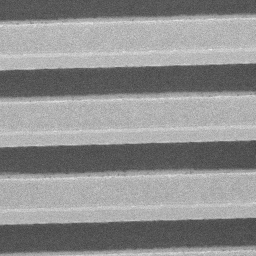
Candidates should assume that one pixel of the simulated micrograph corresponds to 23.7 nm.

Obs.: lines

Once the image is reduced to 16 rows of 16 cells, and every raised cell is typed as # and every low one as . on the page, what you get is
................
...#############
################
################
................
................
################
################
################
................
................
################
################
################
................
................